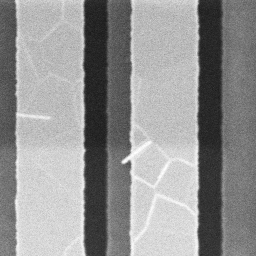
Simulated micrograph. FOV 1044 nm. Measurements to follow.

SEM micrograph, lines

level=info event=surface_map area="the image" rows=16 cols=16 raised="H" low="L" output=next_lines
HHHHHLLHHHHHLLHH
HHHHHLLHHHHHLLHH
HHHHHLLHHHHHLLHH
HHHHHLLHHHHHLLHH
HHHHHLLHHHHHLLHH
HHHHHLLHHHHHLLHH
HHHHHLLHHHHHLLHH
HHHHHLLHHHHHLLHH
HHHHHLLHHHHHLLHH
HHHHHLLHHHHHLLHH
HHHHHLLHHHHHLLHH
HHHHHLLHHHHHLLHH
HHHHHLLHHHHHLLHH
HHHHHLLHHHHHLLHH
HHHHHLLHHHHHLLHH
HHHHHLLHHHHHLLHH